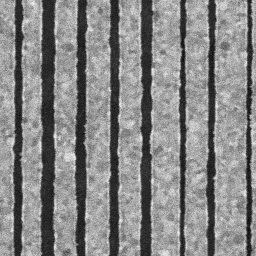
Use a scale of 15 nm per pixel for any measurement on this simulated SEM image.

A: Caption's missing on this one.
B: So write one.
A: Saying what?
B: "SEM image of parallel lines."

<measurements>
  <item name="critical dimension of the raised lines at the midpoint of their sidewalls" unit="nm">332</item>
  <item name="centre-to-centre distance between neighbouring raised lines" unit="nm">498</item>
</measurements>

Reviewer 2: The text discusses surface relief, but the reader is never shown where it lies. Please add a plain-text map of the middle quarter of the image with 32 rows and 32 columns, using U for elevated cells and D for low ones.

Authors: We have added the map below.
UUUDDDUUUUUDDDUUUUUDDDUUUUUUUDDU
UUUDDDUUUUUDDDUUUUUDDDUUUUUUUDDU
UUUDDDUUUUUDDDUUUUUDDDUUUUUUUDDU
UUUDDDUUUUUDDDUUUUUDDDUUUUUUUDDU
UUUDDDUUUUUDDDUUUUUDDDUUUUUUUDDU
UUUDDDUUUUUDDDUUUUUUDDUUUUUUUDDU
UUUDDDUUUUUDDDUUUUUUDDUUUUUUUDDU
UUUDDDUUUUUDDDUUUUUUDDUUUUUUUDDU
UUUDDDUUUUUDDDUUUUUDDDUUUUUUUDDU
UUUDDDUUUUUDDDUUUUUDDDUUUUUUUDDU
UUUDDDUUUUUDDDUUUUUDDDUUUUUUUDDU
UUUDDDUUUUUDDDUUUUUDDDUUUUUUUDDU
UUUDDDUUUUUDDDUUUUUDDDUUUUUUUDDU
UUUDDDUUUUUDDDUUUUUDDDUUUUUUUDDU
UUUDDDUUUUUUDDUUUUUDDDUUUUUUUDDU
UUUDDUUUUUUDDDUUUUUDDDUUUUUUUDDU
UUUDDUUUUUUDDDUUUUUDDDUUUUUUUDDU
UUUDDUUUUUUDDDUUUUUDDDUUUUUUUDDU
UUUDDUUUUUUDDDUUUUUDDDUUUUUUUDDU
UUUDDUUUUUUDDDUUUUUDDDUUUUUUUDDU
UUUDDUUUUUUDDDUUUUUDDDUUUUUUUDDU
UUUDDDUUUUUDDDUUUUUDDDUUUUUUUDDU
UUUDDDUUUUUDDDUUUUUDDDUUUUUUUDDU
UUUDDDUUUUUDDDUUUUUDDDUUUUUUUDDU
UUUDDDUUUUUDDDUUUUUDDDUUUUUUUDDU
UUUDDDUUUUUDDDUUUUUDDDUUUUUUUDDU
UUUDDDUUUUUDDDUUUUUDDDUUUUUUUDDU
UUUDDDUUUUUDDDUUUUUDDDUUUUUUUDDU
UUUDDDUUUUUDDDUUUUUDDDUUUUUUUDDU
UUUDDDUUUUUDDDUUUUUDDDUUUUUUUDDU
UUUDDDUUUUUDDDUUUUUDDDUUUUUUUDUU
UUUDDDUUUUUDDDUUUUUDDDUUUUUUUDUU